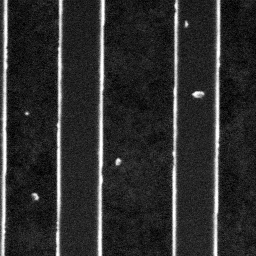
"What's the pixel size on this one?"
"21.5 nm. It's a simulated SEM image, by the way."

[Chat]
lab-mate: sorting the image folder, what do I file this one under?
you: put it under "lines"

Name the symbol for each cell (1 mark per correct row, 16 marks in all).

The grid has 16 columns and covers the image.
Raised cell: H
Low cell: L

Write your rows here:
LLLLHHLLLLLHHHLL
LLLLHHLLLLLHHHLL
LLLLHHLLLLLHHHLL
LLLLHHLLLLLHHHLL
LLLLHHLLLLLHHHLL
LLLLHHLLLLLHHHLL
LLLLHHLLLLLHHHLL
LLLLHHLLLLLHHHLL
LLLLHHLLLLLHHHLL
LLLLHHLLLLLHHHLL
LLLLHHLLLLLHHHLL
LLLLHHLLLLLHHHLL
LLLLHHLLLLLHHHLL
LLLLHHLLLLLHHHLL
LLLLHHLLLLLHHHLL
LLLLHHLLLLLHHHLL